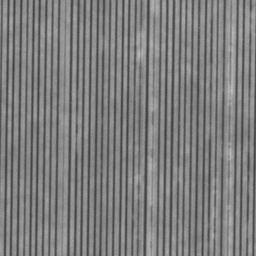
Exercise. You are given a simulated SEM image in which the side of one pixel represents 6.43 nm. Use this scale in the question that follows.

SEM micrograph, parallel lines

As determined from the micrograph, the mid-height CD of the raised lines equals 4.88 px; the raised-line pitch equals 41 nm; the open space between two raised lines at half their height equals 12.9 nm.